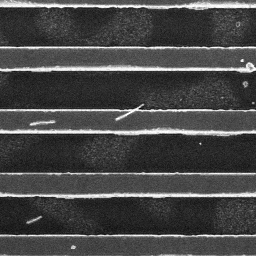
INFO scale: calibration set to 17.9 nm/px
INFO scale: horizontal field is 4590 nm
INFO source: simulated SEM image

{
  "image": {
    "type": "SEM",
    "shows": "lines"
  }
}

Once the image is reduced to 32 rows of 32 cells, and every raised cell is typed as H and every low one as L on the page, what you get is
HHHHHHHHHHHHHHHHHHHHHHHHHHHHHHHH
LLLLLLLLLLLLLLLLLLLLLLLLLLLLLLLL
LLLLLLLLLLLLLLLLLLLLLLLLLLLLLLLL
LLLLLLLLLLLLLLLLLLLLLLLLLLLLLLLL
LLLLLLLLLLLLLLLLLLLLLLLLLLLLLLLL
LLLLLLLLLLLLLLLLLLLLLLLLLLLLLLLL
HHHHHHHHHHHHHHHHHHHHHHHHHHHHHHHH
HHHHHHHHHHHHHHHHHHHHHHHHHHHHHHHH
HHHHHHHHHHHHHHHHHHHHHHHHHHHHHHHH
LLLLLLLLLLLLLLLLLLLLLLLLLLLLLLLL
LLLLLLLLLLLLLLLLLLLLLLLLLLLLLLLL
LLLLLLLLLLLLLLLLLLLLLLLLLLLLLLLL
LLLLLLLLLLLLLLLLLLLLLLLLLLLLLLLL
LLLLLLLLLLLLLLLLLLLLLLLLLLLLLLLL
HHHHHHHHHHHHHHHHHHHHHHHHHHHHHHHH
HHHHHHHHHHHHHHHHHHHHHHHHHHHHHHHH
HHHHHHHHHHHHHHHHHHHHHHHHHHHHHHHH
LLLLLLLLLLLLLLLLLLLLLLLLLLLLLLLL
LLLLLLLLLLLLLLLLLLLLLLLLLLLLLLLL
LLLLLLLLLLLLLLLLLLLLLLLLLLLLLLLL
LLLLLLLLLLLLLLLLLLLLLLLLLLLLLLLL
LLLLLLLLLLLLLLLLLLLLLLLLLLLLLLLL
HHHHHHHHHHHHHHHHHHHHHHHHHHHHHHHH
HHHHHHHHHHHHHHHHHHHHHHHHHHHHHHHH
HHHHLHHLHHHHHLLLLHHHLLLHHHHHHLLL
LLLLLLLLLLLLLLLLLLLLLLLLLLLLLLLL
LLLLLLLLLLLLLLLLLLLLLLLLLLLLLLLL
LLLLLLLLLLLLLLLLLLLLLLLLLLLLLLLL
LLLLLLLLLLLLLLLLLLLLLLLLLLLLLLLL
HHHHHHHHHHHHHHHHHHHHHHHLHHHHHHHH
HHHHHHHHHHHHHHHHHHHHHHHHHHHHHHHH
HHHHHHHHHHHHHHHHHHHHHHHHHHHHHHHH